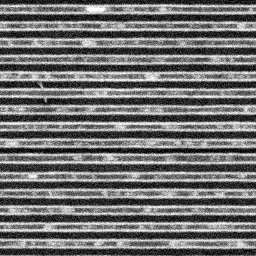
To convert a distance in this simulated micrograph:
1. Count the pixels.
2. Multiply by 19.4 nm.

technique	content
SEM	parallel lines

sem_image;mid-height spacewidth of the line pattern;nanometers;177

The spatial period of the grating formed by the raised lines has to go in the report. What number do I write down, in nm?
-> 325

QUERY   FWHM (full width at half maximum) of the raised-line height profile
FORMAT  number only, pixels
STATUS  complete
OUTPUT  7.38